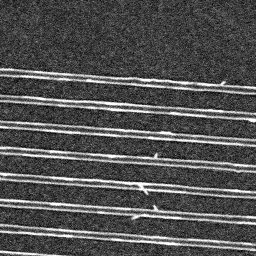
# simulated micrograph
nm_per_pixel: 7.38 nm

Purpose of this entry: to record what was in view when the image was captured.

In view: parallel lines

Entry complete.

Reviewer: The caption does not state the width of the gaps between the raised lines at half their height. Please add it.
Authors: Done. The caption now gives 140 nm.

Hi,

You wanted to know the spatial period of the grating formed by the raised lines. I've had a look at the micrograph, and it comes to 192 nanometres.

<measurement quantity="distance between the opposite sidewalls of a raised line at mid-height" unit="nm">50.6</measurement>